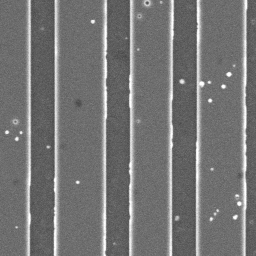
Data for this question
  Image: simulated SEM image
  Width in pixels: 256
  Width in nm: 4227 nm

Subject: lines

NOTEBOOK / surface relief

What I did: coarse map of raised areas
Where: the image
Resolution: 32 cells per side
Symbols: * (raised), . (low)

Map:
****...******...******...******.
****...******...******...******.
****...******...******...******.
****...******...******...******.
****...******...******...******.
****...******...*****....******.
****...******...*****....******.
****...******...*****....******.
****...******...*****....******.
****...******...*****....******.
****...******...*****....******.
****...******...*****....******.
****...******...*****....******.
****...******...*****....******.
****...******...*****....******.
****...******...*****....******.
****...******...*****....******.
****...******...*****....******.
****...******...*****....******.
****...******...*****....******.
****...******...*****....******.
****...******...*****....******.
****...******...*****....******.
****...******...*****....******.
****...******...*****....******.
****...******...*****....******.
****...******...*****....******.
****...******...*****....******.
****...******...*****....******.
****...******...*****....******.
****...******...*****....******.
****...******...*****....******.